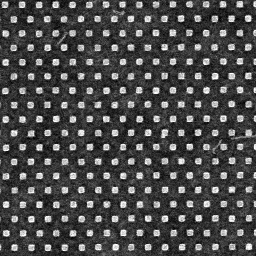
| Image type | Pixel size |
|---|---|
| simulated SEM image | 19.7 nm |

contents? a regular array of raised bodies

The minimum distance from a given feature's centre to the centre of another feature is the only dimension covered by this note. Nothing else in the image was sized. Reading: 319 nanometres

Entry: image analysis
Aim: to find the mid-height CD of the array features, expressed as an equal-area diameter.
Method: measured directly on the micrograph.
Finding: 127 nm